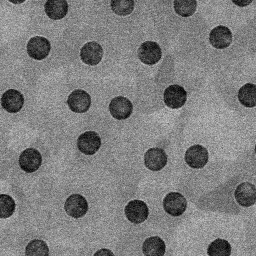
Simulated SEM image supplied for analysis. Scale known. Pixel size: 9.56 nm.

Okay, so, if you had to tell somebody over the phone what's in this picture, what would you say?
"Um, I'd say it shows a regular array of holes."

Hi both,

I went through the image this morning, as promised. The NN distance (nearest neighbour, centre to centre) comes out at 472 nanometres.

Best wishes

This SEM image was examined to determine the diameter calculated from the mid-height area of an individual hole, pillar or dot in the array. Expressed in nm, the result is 235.